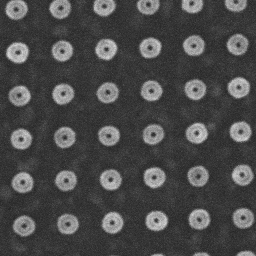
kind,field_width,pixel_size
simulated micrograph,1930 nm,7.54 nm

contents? a regular array of ring-shaped raised bodies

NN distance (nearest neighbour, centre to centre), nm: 326